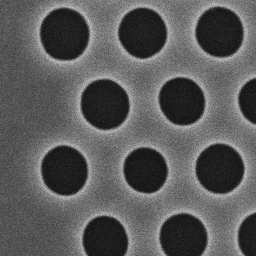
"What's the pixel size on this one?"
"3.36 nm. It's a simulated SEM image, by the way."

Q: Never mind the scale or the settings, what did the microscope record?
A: a regular array of holes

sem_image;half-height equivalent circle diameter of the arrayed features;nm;167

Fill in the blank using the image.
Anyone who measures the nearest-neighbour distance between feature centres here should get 260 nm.